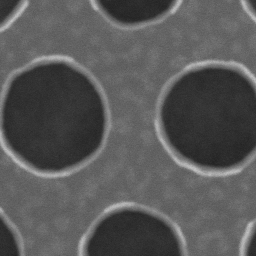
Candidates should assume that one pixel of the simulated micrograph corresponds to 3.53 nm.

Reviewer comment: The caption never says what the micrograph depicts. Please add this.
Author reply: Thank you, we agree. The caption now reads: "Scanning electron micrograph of holes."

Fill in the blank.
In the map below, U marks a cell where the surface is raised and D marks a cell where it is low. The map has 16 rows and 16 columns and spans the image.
DUUUUUDDDDDUUUUU
UUUUUUUDDUUUUUUU
UUUUUUUUUUUUUUUU
UUUUUUUUUUUUUUUU
UDDDDUUUUUUUDDDU
DDDDDDUUUUUDDDDD
DDDDDDUUUUDDDDDD
DDDDDDDUUUDDDDDD
DDDDDDDUUUDDDDDD
UDDDDDUUUUUDDDDD
UUDDDUUUUUUUUDUU
UUUUUUUUUUUUUUUU
UUUUUUUUUUUUUUUU
UUUUUUUDDDUUUUUU
DUUUUUDDDDDUUUUU
DUUUUDDDDDDUUUUD